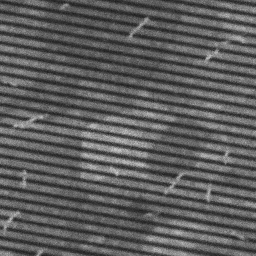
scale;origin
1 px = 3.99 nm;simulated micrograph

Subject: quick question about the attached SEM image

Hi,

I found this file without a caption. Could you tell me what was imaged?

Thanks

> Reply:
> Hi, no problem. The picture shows parallel lines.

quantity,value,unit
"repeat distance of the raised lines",40.4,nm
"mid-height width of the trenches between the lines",21.1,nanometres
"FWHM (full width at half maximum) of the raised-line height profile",0.0211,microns